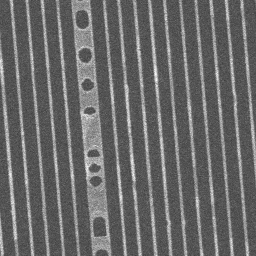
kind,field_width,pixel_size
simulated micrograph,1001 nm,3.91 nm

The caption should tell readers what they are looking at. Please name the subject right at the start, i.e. parallel lines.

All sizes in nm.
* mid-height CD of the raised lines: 9.2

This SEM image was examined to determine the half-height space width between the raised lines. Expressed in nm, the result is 49.8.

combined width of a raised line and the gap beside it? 59.9 nanometers